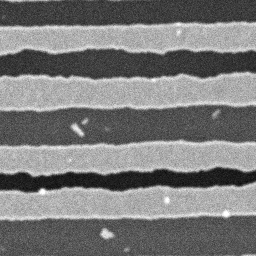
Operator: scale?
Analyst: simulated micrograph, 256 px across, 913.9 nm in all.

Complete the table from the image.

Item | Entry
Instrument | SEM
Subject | lines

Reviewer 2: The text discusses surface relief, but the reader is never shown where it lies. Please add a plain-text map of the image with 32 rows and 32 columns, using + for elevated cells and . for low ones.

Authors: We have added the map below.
................................
................................
................................
++++++++++++++++++++++++++++++++
++++++++++++++++++++++++++++++++
++++++++++++++++++++++++++++++++
++....++...........++...........
................................
................................
...+.+................++...+++++
++++++++++++++++++++++++++++++++
++++++++++++++++++++++++++++++++
++++++++++++++++++++++++++++++++
++++++++....++...+++............
................................
................................
................................
................................
++++++++++++++++++++++++++++++++
++++++++++++++++++++++++++++++++
++++++++++++++++++++++++++++++++
++.++++++...+++.................
................................
........++........++++.++.++++++
++++++++++++++++++++++++++++++++
++++++++++++++++++++++++++++++++
++++++++++++++++++++++++++++++++
................................
................................
................................
................................
................................